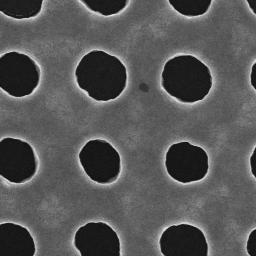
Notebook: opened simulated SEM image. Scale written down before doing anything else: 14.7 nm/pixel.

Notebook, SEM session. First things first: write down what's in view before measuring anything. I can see holes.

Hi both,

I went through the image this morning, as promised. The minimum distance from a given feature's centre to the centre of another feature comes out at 1.24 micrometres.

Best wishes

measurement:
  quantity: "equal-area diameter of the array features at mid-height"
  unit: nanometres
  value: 665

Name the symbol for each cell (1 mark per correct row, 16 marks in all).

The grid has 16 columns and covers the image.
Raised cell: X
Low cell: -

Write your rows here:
---XXX--XXX--XXX
XXXXXXXXXXXXXXXX
XXXXXXXXXXXXXXXX
--XXX--XXXX-XXXX
--XXX---XX---XXX
--XXX---XX---XXX
XXXXXXXXXXXXXXXX
XXXXXXXXXXXXXXXX
XXXXXXXXXXXXXXXX
--XXX--XXXX--XXX
--XXX--XXX---XXX
XXXXXXXXXXXXXXXX
XXXXXXXXXXXXXXXX
XXXXXXXXXXXXXXXX
--XXX--XXX---XXX
--XXX--XXX---XX-